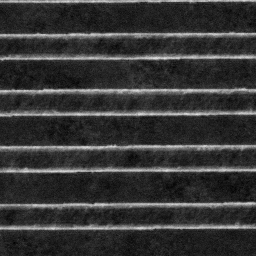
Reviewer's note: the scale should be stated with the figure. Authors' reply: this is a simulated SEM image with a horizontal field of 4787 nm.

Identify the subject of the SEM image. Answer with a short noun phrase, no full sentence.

lines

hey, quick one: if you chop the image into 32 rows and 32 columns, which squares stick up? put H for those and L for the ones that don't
LLLLLLLLLLLLLLLLLLLLLLLLLLLLLLLL
LLLLLLLLLLLLLLLLLLLLLLLLLLLLLLLL
LLLLLLLLLLLLLLLLLLLLLLLLLLLLLLLL
LLLLLLLLLLLLLLLLLLLLLLLLLLLLLLLL
HHHHHHHHHHHHHHHHHHHHHHHHHHHHHHHH
HHHHHHHHHHHHHHHHHHHHHHHHHHHHHHHH
HHHHHHHHHHHHHHHHHHHHHHHHHHHHHHHH
LLLLLLLLLLLLLLLLLLLLLLLLLLLLLLLL
LLLLLLLLLLLLLLLLLLLLLLLLLLLLLLLL
LLLLLLLLLLLLLLLLLLLLLLLLLLLLLLLL
LLLLLLLLLLLLLLLLLLLLLLLLLLLLLLLL
HHHHHHHHHHHHHHHHHHHHHHHHHHHHHHHH
HHHHHHHHHHHHHHHHHHHHHHHHHHHHHHHH
HHHHHHHHHHHHHHHHHHHHHHHHHHHHHHHH
LLLLLLLLLLLLLLLLLLLLLLLLLLLLLLLL
LLLLLLLLLLLLLLLLLLLLLLLLLLLLLLLL
LLLLLLLLLLLLLLLLLLLLLLLLLLLLLLLL
LLLLLLLLLLLLLLLLLLLLLLLLLLLLLLLL
LHHHHHHHHHHHHHHHHHHHHHHHHHHHHHHH
HHHHHHHHHHHHHHHHHHHHHHHHHHHHHHHH
HHHHHHHHHHHHHHHHHHHHHHHHHHHHHHHH
LLLLLLLLLLLLLLLLLLLLLLLLLLLLLLLL
LLLLLLLLLLLLLLLLLLLLLLLLLLLLLLLL
LLLLLLLLLLLLLLLLLLLLLLLLLLLLLLLL
LLLLLLLLLLLLLLLLLLLLLLLLLLLLLLLL
LLLLLLLLLLLLLLLLLLLLLLLLLLLLLLLL
HHHHHHHHHHHHHHHHHHHHHHHHHHHHHHHH
HHHHHHHHHHHHHHHHHHHHHHHHHHHHHHHH
LLLLLLLLLLLLLLLLLLLLLLLLLLLLLLLL
LLLLLLLLLLLLLLLLLLLLLLLLLLLLLLLL
LLLLLLLLLLLLLLLLLLLLLLLLLLLLLLLL
LLLLLLLLLLLLLLLLLLLLLLLLLLLLLLLL